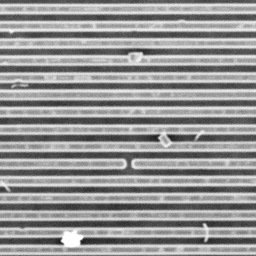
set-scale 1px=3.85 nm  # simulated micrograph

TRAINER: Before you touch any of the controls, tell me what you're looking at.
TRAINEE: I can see parallel lines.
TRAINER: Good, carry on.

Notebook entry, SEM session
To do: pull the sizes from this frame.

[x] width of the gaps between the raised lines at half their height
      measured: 33.7 nanometres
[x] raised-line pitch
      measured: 0.0663 um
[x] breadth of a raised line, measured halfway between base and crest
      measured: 33.7 nanometers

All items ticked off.